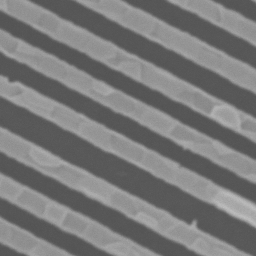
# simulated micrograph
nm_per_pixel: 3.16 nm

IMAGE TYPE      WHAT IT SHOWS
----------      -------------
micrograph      parallel lines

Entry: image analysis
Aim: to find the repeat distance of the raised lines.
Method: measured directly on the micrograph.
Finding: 131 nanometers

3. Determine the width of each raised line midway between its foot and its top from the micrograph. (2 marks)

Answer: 21.3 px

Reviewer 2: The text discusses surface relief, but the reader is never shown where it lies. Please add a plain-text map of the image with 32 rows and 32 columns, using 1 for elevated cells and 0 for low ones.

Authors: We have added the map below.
11110000001111110000001111100000
11111100000011111100000011111000
00111111000000111111000000111110
00001111110000001111110000001111
11000011111100000011111100000011
11110000111111000000111111000000
11111100001111110000001111110000
00111111000011111100000011111100
00001111110000111111000000111111
00000011111000001111110000001111
11100000111110000011111100000111
11111000001111100000111111000000
01111110000011111000001111100000
00011111100000111110000011111000
00000111111000001111100000111110
00000001111100000011111000011111
10000000011111000000111110000011
11100000000111110000011111100001
11111000000011111100000111111000
01111110000000011111000001111110
00011111100000000111110000011111
00000111111000000001111100000111
11000001111110000000111111000001
11110000011111100000000111110000
11111100000111111000000011111100
00111111000001111110000000111111
00001111100000011111100000001111
10000011111100000111110000000011
11100001111110000001111110000000
11110000001111100000111111000000
11111100000011111000000111110000
00111111000001111110000011111100